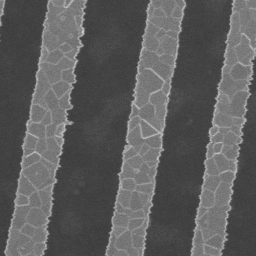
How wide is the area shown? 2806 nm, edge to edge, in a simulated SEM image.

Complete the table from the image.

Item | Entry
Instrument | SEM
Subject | one or a few lines or trenches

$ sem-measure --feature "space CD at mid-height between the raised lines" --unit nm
542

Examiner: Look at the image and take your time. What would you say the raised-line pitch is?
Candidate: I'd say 0.996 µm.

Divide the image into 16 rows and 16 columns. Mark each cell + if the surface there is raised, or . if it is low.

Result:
...++....++....+
...++....++...++
...++....++...++
...++....++...++
..+++....++...++
..++....+++...++
..++....++....+.
..++....++...++.
..++....++...++.
.+++....++...++.
.+++....++...++.
.++....+++...++.
.++....++....+..
.++....++...++..
.++....++...++..
+++....++...++..